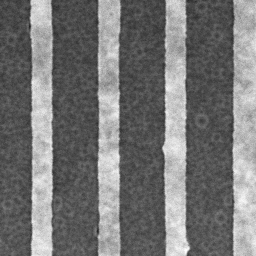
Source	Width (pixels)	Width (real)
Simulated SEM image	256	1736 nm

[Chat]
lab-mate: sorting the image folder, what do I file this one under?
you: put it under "one or a few lines or trenches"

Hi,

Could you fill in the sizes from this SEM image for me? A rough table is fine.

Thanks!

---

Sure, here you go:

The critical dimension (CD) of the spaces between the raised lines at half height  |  319 nanometres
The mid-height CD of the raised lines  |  19.5 pixels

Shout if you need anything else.